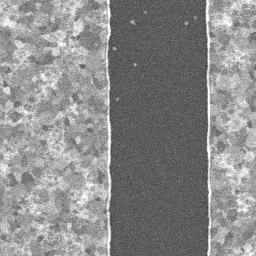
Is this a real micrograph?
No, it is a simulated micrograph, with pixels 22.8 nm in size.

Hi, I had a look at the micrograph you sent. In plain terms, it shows one or a few lines or trenches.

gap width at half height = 2290 nm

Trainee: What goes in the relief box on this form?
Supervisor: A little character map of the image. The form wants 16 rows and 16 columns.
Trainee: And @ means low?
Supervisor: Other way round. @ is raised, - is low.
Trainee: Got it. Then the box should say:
@@@@@@@------@@@
@@@@@@@------@@@
@@@@@@@------@@@
@@@@@@@------@@@
@@@@@@@------@@@
@@@@@@@------@@@
@@@@@@@------@@@
@@@@@@@------@@@
@@@@@@@------@@@
@@@@@@@------@@@
@@@@@@@------@@@
@@@@@@@------@@@
@@@@@@@------@@@
@@@@@@@------@@@
@@@@@@@------@@@
@@@@@@@------@@@